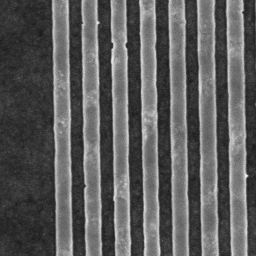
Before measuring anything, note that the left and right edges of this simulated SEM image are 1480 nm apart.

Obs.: parallel lines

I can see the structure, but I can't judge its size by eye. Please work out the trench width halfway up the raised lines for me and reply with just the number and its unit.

77.3 nm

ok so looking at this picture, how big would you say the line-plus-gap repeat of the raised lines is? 0.168 microns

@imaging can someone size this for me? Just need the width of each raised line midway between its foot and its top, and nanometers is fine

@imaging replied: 91